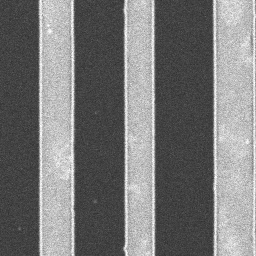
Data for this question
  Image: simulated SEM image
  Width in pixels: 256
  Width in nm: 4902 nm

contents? one or a few lines or trenches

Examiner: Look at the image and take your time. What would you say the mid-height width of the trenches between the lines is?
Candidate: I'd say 596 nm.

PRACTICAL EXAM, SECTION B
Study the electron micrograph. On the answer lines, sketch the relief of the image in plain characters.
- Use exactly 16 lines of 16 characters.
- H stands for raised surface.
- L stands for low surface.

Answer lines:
HHHLLHHHLLHHHLLL
HHHLLHHHLLHHHLLL
HHHLLHHHLLHHHLLL
HHHLLHHHLLHHHLLL
HHHLLHHHLLHHHLLL
HHHLLHHHLLHHHLLL
HHHLLHHHLLHHHLLL
HHHLLHHHLLHHHLLL
HHHLHHHHLLHHHLLL
HHHLHHHHLLHHHLLL
HHHLLHHHLLHHHLLL
HHHLLHHHLLHHHLLL
HHHLLHHHLLHHHLLL
HHHLLHHHLLHHHLLL
HHHLLHHHLLHHHLLL
HHHLLHHHLLHHHLLL